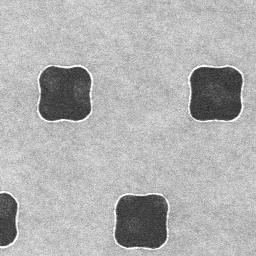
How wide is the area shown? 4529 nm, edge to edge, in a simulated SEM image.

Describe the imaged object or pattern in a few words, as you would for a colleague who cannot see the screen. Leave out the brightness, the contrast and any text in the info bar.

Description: raised bodies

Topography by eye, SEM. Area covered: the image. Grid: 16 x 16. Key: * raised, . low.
................
................
................
................
...**.......***.
..****......***.
..****......***.
...**.......**..
................
................
................
................
*......***......
*......***......
*......***......
........**......